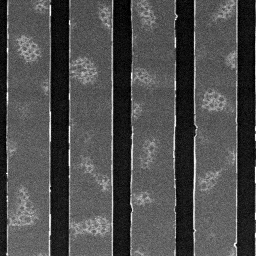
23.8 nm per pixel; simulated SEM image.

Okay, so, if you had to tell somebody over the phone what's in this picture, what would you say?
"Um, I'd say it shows one or a few lines or trenches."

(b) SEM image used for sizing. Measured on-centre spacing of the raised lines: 62.4 px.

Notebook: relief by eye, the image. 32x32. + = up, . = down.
.+++++...+++++..++++++..++++++..
.+++++...+++++..++++++..++++++..
.+++++...+++++...+++++..++++++..
.+++++...+++++...+++++..++++++..
.+++++...+++++...+++++..++++++..
.+++++...+++++...+++++..++++++..
.+++++...+++++...+++++..++++++..
.+++++...+++++...+++++..++++++..
.+++++...+++++...+++++..++++++..
.+++++...+++++...+++++..++++++..
.+++++...+++++..++++++..++++++..
.+++++...+++++..++++++..++++++..
.+++++...+++++...+++++..++++++..
.+++++...+++++...+++++..++++++..
.+++++...+++++...+++++..++++++..
.+++++...+++++...+++++..++++++..
.+++++...+++++...+++++...+++++..
.+++++...+++++...+++++..++++++..
.+++++...+++++...+++++..++++++..
.+++++...+++++...+++++..++++++..
.+++++...+++++...+++++..++++++..
.+++++...+++++..++++++..++++++..
.+++++...+++++..++++++..++++++..
.+++++...+++++..++++++..++++++..
.+++++...+++++..++++++..+++++...
.+++++...+++++..++++++..+++++...
.+++++...+++++..++++++..+++++...
.+++++...+++++..++++++..+++++...
.+++++...+++++..++++++..+++++...
.+++++...+++++..++++++..+++++...
.+++++...+++++..++++++..+++++...
.+++++...+++++..++++++..+++++...